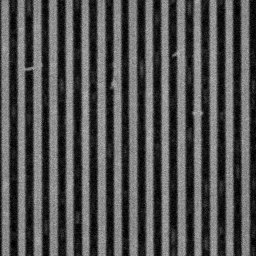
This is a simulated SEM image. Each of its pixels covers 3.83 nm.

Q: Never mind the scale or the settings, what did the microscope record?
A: parallel lines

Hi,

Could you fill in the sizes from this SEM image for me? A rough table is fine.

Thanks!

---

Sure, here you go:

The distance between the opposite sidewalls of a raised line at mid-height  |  0.0268 µm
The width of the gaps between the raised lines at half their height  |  34 nm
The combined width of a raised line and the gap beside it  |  0.0614 µm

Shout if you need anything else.